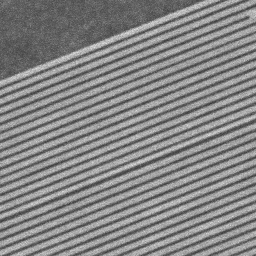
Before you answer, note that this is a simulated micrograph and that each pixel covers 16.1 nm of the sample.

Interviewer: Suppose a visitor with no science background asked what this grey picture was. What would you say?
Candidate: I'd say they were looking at parallel lines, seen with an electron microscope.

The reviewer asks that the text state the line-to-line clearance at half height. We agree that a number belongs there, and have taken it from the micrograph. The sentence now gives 61.9 nm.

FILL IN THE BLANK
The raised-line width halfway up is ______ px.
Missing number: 4.89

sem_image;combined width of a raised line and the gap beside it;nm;134